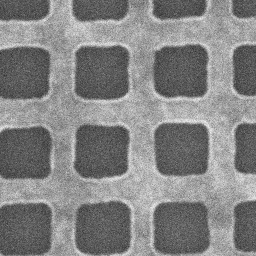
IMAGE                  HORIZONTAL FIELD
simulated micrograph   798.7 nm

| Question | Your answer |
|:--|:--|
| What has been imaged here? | holes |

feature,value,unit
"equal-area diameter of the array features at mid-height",0.185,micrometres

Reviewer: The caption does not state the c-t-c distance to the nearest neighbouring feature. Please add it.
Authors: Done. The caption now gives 246 nm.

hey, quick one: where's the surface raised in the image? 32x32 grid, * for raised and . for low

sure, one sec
......***.......***.......***...
......***.......***.......***...
.....*****...*******************
********************************
********************************
********************************
......***.......****......***...
......***.......***.......***...
......***.......***.......***...
......***.......***.......***...
......***.......***.......***...
......***.......****......****..
***********...******************
********************************
********************************
********************.....*****..
......****......***.......***...
......***.......***.......***...
......***.......***.......***...
......***.......***.......***...
......***.......***.......***...
......****......****......****..
********************************
********************************
********************************
**....****......****.....*****..
......****......***.......***...
......***.......***.......***...
......***.......***.......***...
.......**.......***.......***...
......***.......***.......***...
......****......****.....*******